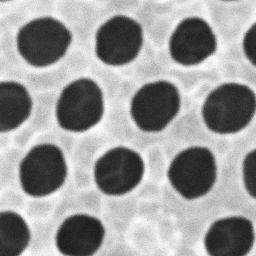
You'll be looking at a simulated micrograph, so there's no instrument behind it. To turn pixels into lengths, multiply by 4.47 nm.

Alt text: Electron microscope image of a regular array of holes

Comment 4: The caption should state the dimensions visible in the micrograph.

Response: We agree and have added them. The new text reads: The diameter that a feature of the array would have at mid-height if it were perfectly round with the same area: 0.227 µm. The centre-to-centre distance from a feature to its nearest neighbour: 0.331 micrometres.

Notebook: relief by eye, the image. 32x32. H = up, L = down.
HHHHHHHHHHHHHHHHHHHHHHHHHHHHHHHH
HHHHHHHHHHHHHHHHHHHHHHHHHHHHHHHH
HHHHLLLHHHHHHHLLLHHHHHHLLLHHHHHH
HHHLLLLLHHHHLLLLLLHHHHLLLLHHHHHL
HHLLLLLLLHHHLLLLLLHHHLLLLLLHHHHL
HHLLLLLLLHHHLLLLLLHHHLLLLLLHHHLL
HHLLLLLLHHHHLLLLLHHHHLLLLLLHHHHL
HHHLLLLHHHHHLLLLLHHHHHLLLLHHHHHL
HHHHHHHHHHHHHHHHHHHHHHHHHHHHHHHH
HHHHHHHHHHHHHHHHHHHHHHHHHHHHHHHH
LLLHHHHHHLLLHHHHHHLLLLHHHHHHLLHH
LLLHHHHHLLLLLHHHHLLLLLHHHHLLLLLL
LLLLHHHLLLLLLHHHLLLLLLLHHHLLLLLL
LLLLHHHLLLLLLHHHLLLLLLLHHLLLLLLL
LLLLHHHLLLLLLHHHLLLLLLHHHLLLLLLL
LLLHHHHLLLLLHHHHHLLLLHHHHHLLLLLH
LHHHHHHHHLHHHHHHHHLLHHHHHHHLLLHH
HHHHHHHHHHHHHHHHHHHHHHHHHHHHHHHH
HHHHLLLHHHHHHHLLHHHHHHHHLLHHHHHH
HHHLLLLLHHHHHLLLLLHHHHLLLLLHHHHL
HHLLLLLLHHHHLLLLLLHHHLLLLLLHHHLL
HHLLLLLLHHHHLLLLLLHHHLLLLLLHHHLL
HHLLLLLLHHHHLLLLLLHHHLLLLLLHHHLL
HHHLLLLHHHHHLLLLLHHHHHLLLLHHHHHL
HHHHLLHHHHHHHHLHHHHHHHHLLHHHHHHL
HHHHHHHHHHHHHHHHHHHHHHHHHHHHHHHH
LLHHHHHHHHHHHHHHHHHHHHHHHHHHHHHH
LLLHHHHHLLLLHHHHHHHHHHHHHHHLLLLH
LLLLHHHLLLLLLHHHHHHHHHHHHHLLLLLL
LLLLHHHLLLLLLHHHHHHHHHHHHHLLLLLL
LLLLHHHLLLLLLHHHHHHHHHHHHHLLLLLL
LLLHHHHLLLLLHHHHHHHHHHHHHHLLLLLH